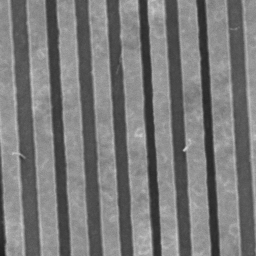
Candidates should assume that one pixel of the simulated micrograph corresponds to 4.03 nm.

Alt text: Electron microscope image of parallel lines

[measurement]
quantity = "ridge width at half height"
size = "18 pixels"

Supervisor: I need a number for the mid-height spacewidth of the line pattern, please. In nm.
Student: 52.8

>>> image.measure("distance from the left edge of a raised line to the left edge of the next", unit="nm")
122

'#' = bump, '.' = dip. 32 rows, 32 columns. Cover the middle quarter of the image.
####...####....####...####...###
####...####....####...####....##
###....####....####...####....##
###....####....####...####....##
####...#####...#####..####....##
####....####...#####..####....##
####....####...#####..####....##
####....####...#####..####....##
####....####...#####..####....##
####....####...#####..#####...##
####....####...#####..####....##
####....####...#####..####....##
####....####...#####..#####...##
####....####....####...####...##
####....####....####...####...##
####....####....####...####...##
####....####....####...####...##
####....####....####...####....#
#####...####....####...####....#
#####...####....####...####....#
#####...####....####...####...##
#####...#####...#####..####...##
#####....####...#####..####....#
.####....####...#####..####....#
.####...#####...#####..####....#
.####...#####...#####..####....#
.####....####...#####..####....#
.####....####...#####..####....#
.####....####...#####..####....#
.####....####...#####..####....#
.####....####...#####...####...#
.####....####....####...####...#